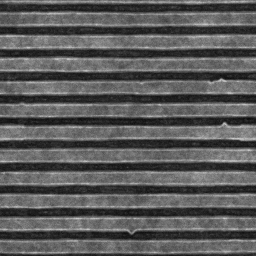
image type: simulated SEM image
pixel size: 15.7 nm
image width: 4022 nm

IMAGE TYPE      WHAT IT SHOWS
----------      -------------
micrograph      parallel lines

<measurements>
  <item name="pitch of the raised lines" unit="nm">357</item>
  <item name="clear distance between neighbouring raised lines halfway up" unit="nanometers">153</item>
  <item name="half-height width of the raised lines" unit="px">13.4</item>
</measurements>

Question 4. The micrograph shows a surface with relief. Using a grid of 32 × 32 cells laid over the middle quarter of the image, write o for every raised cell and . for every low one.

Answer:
oooooooooooooooooooooooooooooooo
oooooooooooooooooooooooooooooooo
................................
................................
oooooooooooooooooooooooooooooooo
oooooooooooooooooooooooooooooooo
oooooooooooooooooooooooooooooooo
....ooooo........ooooooo........
................................
................................
oooooooooooooooooooooooooooooooo
oooooooooooooooooooooooooooooooo
oooooooooooooooooooooooooooooooo
................................
................................
................................
oooooooooooooooooooooooooooooooo
oooooooooooooooooooooooooooooooo
oooooooooooooooooooooooo..oooooo
................................
................................
oooooooooooooooooooooooooooooooo
oooooooooooooooooooooooooooooooo
oooooooooooooooooooooooooooooooo
.oooooooooooooooooo...o.........
................................
................................
oooooooooooooooooooooooooooooooo
oooooooooooooooooooooooooooooooo
oooooooooooooooooooooooooooooooo
................................
................................